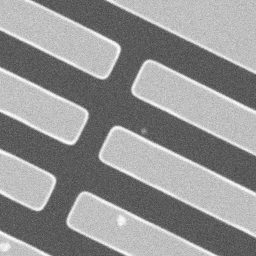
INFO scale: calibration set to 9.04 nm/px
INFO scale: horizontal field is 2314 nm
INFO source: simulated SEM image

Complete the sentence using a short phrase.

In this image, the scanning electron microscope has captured groups of lines, slits or small figures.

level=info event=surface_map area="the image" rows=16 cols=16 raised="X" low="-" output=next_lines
XXX-----XXXXXXXX
XXXXX-----XXXXXX
-XXXXXX-----XXXX
---XXXX-------XX
-----XX--XX-----
XXX-----XXXXX---
XXXXX-----XXXXX-
-XXXX------XXXXX
---XX--XX-----XX
------XXXXX-----
XX-----XXXXXX---
XXX------XXXXXX-
-XX--X-----XXXXX
----XXXX-----XXX
-----XXXXXX----X
XX-----XXXXXX---